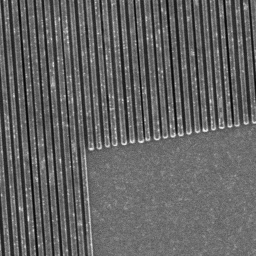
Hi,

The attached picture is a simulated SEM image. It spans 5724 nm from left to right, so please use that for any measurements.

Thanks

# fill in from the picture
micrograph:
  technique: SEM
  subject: parallel lines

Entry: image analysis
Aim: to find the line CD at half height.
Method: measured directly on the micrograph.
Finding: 0.0976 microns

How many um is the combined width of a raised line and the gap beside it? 0.184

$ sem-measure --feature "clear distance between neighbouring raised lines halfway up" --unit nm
78